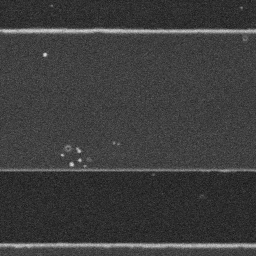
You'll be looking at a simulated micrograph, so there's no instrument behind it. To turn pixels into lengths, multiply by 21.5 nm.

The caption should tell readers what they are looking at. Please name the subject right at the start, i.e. lines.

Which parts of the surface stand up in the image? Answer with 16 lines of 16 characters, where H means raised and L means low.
LLLLLLLLLLLLLLLL
LLLLLLLLLLLLLLLL
HHHHHHHHHHHHHHHH
HHHHHHHHHHHHHHHH
HHHHHHHHHHHHHHHH
HHHHHHHHHHHHHHHH
HHHHHHHHHHHHHHHH
HHHHHHHHHHHHHHHH
HHHHHHHHHHHHHHHH
HHHHHHHHHHHHHHHH
HHHHHHHHHHHHHHHH
LLLLLLLLLLLLLLLL
LLLLLLLLLLLLLLLL
LLLLLLLLLLLLLLLL
LLLLLLLLLLLLLLLL
HHHHHHHHHHHHHHHH